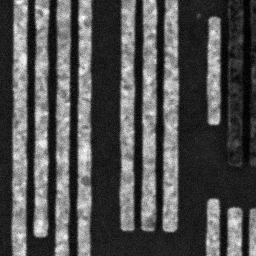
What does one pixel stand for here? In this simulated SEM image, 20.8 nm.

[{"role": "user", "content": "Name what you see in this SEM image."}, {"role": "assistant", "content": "wiring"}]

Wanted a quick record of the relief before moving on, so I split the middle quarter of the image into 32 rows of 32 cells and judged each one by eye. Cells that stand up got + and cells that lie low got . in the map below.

+...++.........++...+++..+++....
+...++.........++...+++..+++....
+...+++........++...+++..+++....
+...+++........++...+++..+++....
+...+++.......+++...+++..+++....
+...+++.......+++...+++..+++....
+...+++.......+++...+++..+++....
+...+++.......+++...+++..+++....
+...+++.......+++...+++..+++....
+...++........+++...+++..+++....
+...++........+++...+++..+++....
+...++........+++...+++..+++....
+...++........+++...+++..+++....
+...++........+++...+++..+++....
+...++........+++...+++..+++....
+...++........+++...+++..+++....
+...+++.......+++...+++..+++....
+...++........+++...+++..+++....
+...++........+++...+++..+++....
+...++........+++...+++..+++....
+...++........+++...+++..+++....
+...+++.......+++...+++..+++....
+...+++.......+++...+++..+++....
+...+++........++...+++..+++....
+...+++........++...+++..+++....
+...+++........++...+++..+++....
+...+++........++...+++..+++....
+...++........+++...+++..+++....
+...++........+++...+++..+++....
+...++........+++...+++..+++....
+...+++.......+++...+++..+++....
+...+++.......+++...+++..+++....